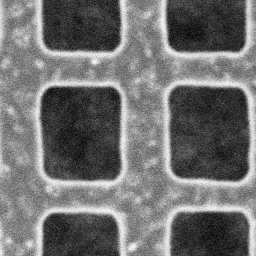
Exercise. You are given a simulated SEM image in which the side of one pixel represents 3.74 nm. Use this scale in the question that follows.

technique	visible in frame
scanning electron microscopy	holes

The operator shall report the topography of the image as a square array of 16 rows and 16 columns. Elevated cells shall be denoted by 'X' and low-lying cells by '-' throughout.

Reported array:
XXX-----XX-----X
XXX-----XX-----X
XXX-----XX-----X
XXXXXXXXXXXXXXXX
XXXXXXXXXXXXXXXX
XXX----XXXX----X
XXX-----XX------
XX------XXX-----
XXX-----XXX-----
XXX-----XXX-----
XXX-----XXX-----
XXXXXXXXXXXXXXXX
XXXXXXXXXXXXXXXX
XXX----XXXX----X
XXX----XXXX-----
XXX-----XXX-----